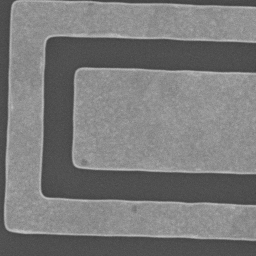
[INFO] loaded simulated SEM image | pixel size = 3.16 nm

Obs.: groups of lines, slits or small figures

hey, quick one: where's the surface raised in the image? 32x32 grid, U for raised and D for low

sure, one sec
DDUUUUUUUUUUUUUUUUUUUDDDDDDDDDDD
DUUUUUUUUUUUUUUUUUUUUUUUUUUUUUUU
DUUUUUUUUUUUUUUUUUUUUUUUUUUUUUUU
DUUUUUUUUUUUUUUUUUUUUUUUUUUUUUUU
DUUUUUUDUUUUUUUUUUUUUUUUUUUUUUUU
DUUUUUDDDDDDDDDDDDDDDDDDDDDDDDDD
DUUUUUDDDDDDDDDDDDDDDDDDDDDDDDDD
DUUUUDDDDDDDDDDDDDDDDDDDDDDDDDDD
DUUUUDDDDDDDDDDDDDDDDDDDDDDDDDDD
DUUUUDDDDUUUUUUUUUUUUUUUUUUUUUUU
DUUUUDDDDUUUUUUUUUUUUUUUUUUUUUUU
DUUUUDDDDUUUUUUUUUUUUUUUUUUUUUUU
DUUUUDDDDUUUUUUUUUUUUUUUUUUUUUUU
DUUUUDDDDUUUUUUUUUUUUUUUUUUUUUUU
DUUUUDDDDUUUUUUUUUUUUUUUUUUUUUUU
DUUUUDDDDUUUUUUUUUUUUUUUUUUUUUUU
DUUUUDDDDUUUUUUUUUUUUUUUUUUUUUUU
DUUUUDDDDUUUUUUUUUUUUUUUUUUUUUUU
DUUUUDDDDUUUUUUUUUUUUUUUUUUUUUUU
DUUUUDDDDUUUUUUUUUUUUUUUUUUUUUUU
DUUUUDDDDUUUUUUUUUUUUUUUUUUUUUUU
DUUUUDDDDDDDDDDDDDDDDDDDUDUUUUUU
DUUUUDDDDDDDDDDDDDDDDDDDDDDDDDDD
DUUUUDDDDDDDDDDDDDDDDDDDDDDDDDDD
DUUUUUDDDDDDDDDDDDDDDDDDDDDDDDDD
DUUUUUUUUUUUUUUUUUUUUUUUUUUDDDDD
DUUUUUUUUUUUUUUUUUUUUUUUUUUUUUUU
DUUUUUUUUUUUUUUUUUUUUUUUUUUUUUUU
DUUUUUUUUUUUUUUUUUUUUUUUUUUUUUUU
DDDDDDDDDDDDDDDDDDUUUUUUUUUUUUUU
DDDDDDDDDDDDDDDDDDDDDDDDDDDDDDDD
DDDDDDDDDDDDDDDDDDDDDDDDDDDDDDDD